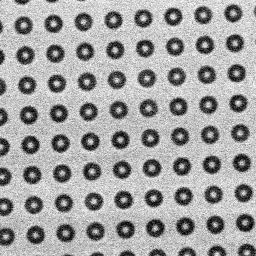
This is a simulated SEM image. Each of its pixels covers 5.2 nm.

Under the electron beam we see an array of small figures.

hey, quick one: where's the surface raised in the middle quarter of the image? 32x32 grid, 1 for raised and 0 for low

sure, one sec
11111111111111111111111111111111
11111111111111111111001111100011
11110001111000011110000111000011
11110000111000001100000111000001
01100000111000001100000111000011
01110000111000011110001111110111
11110001111111111111111111111111
11111111111111111111111111111111
11111111111111111111111111110111
11111111111100011110000111100001
11110000111100001110000111000001
01110000111000001110000111000001
01110000111000001110000111100011
01110000111100011111111111111111
11111111111111111111111111111111
11111111111111111111111111111111
11111111111111111111000111100001
11111000111100001110000011100001
01110000011100001110000011100001
00110000011100001110000011100001
01110000011100001111000111111111
01111000111111111111111111111111
11111111111111111111111111111111
11111111111111111111111111110001
11111111111110001111000011100000
01111000011100000111000011100000
00111000011100000111000011100000
00111000011100000111000011110001
00111000011110001111100111111111
11111111111111111111111111111111
11111111111111111111111111111111
11111111111111111111100011110000